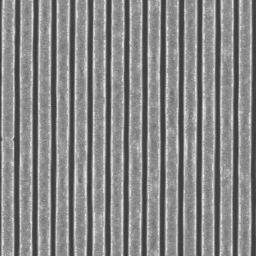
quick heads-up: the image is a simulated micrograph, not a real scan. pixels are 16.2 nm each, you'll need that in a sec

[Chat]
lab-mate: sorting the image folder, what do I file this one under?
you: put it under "parallel lines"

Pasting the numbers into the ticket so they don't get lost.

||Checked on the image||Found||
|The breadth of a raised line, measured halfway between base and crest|206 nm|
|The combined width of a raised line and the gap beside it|18.2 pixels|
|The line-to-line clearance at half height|0.0889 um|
